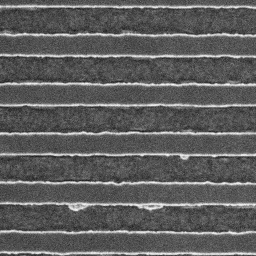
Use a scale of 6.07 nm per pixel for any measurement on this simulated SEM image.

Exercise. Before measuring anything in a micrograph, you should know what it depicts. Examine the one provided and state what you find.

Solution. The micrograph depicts lines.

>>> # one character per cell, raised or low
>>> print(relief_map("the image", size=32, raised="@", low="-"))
@@@@@@@@@@@@@@@@@@@@@@@@@@@@@@@@
--------------------------------
--------------------------------
--------------------------------
@@@@@@@@@@@@@@@@@@@@@@@@@@@@@@@@
@@@@@@@@@@@@@@@@@@@@@@@@@@@@@@@@
@@@@@@@@@@@@@@@@@@@@@@@@@@@@@@@@
--------------------------------
--------------------------------
--------------------------------
@@@@@@@@@@@@--@@@@-----@@-------
@@@@@@@@@@@@@@@@@@@@@@@@@@@@@@@@
@@@@@@@@@@@@@@@@@@@@@@@@@@@@@@@@
--------------------------------
--------------------------------
--------------------------------
--------------------------------
@@@@@@@@@@@@@@@@@@@@@@@@@@@@@@@@
@@@@@@@@@@@@@@@@@@@@@@@@@@@@@@@@
--------------------------@-----
--------------------------------
--------------------------------
--------------------------------
@@@@@@@@@@@@@@@@@@@@@@@@@@@@@@@@
@@@@@@@@@@@@@@@@@@@@@@@@@@@@@@@@
--@@@@-@@@@@@@@@@@@@@@@@@@@@@@@@
--------------------------------
--------------------------------
--------------------------------
@@@@@@@@@@@@@@@@@@@@@@@@@@@@@@@@
@@@@@@@@@@@@@@@@@@@@@@@@@@@@@@@@
@@@@@@@@@@@@@@@@@@@@@@@@@@@@@@@@